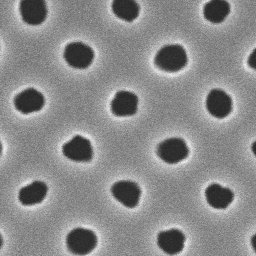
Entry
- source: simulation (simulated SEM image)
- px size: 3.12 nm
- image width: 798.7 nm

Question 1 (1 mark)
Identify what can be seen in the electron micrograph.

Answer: a regular array of holes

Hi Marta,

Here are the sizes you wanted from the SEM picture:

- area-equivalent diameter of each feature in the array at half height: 84.8 nm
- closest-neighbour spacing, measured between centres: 0.204 µm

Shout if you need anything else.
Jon